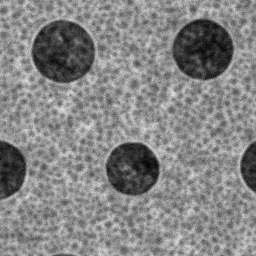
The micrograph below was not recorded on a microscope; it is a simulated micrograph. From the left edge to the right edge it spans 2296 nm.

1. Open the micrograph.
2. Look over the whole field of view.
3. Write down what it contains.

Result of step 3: holes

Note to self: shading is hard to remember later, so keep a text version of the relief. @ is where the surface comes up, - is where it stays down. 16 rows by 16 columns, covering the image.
@@@@@@@@@@@@@@@@
@@@--@@@@@@@--@@
@@----@@@@@----@
@@----@@@@@----@
@@----@@@@@---@@
@@@@@@@@@@@@@@@@
@@@@@@@@@@@@@@@@
@@@@@@@@@@@@@@@@
@@@@@@@@@@@@@@@@
-@@@@@@---@@@@@-
--@@@@@---@@@@@-
-@@@@@@---@@@@@-
@@@@@@@@@@@@@@@@
@@@@@@@@@@@@@@@@
@@@@@@@@@@@@@@@@
@@@@@@@@@@@@@@@@